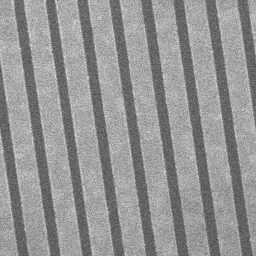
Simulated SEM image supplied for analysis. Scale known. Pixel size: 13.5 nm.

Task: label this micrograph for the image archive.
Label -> parallel lines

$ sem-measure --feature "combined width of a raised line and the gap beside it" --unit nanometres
426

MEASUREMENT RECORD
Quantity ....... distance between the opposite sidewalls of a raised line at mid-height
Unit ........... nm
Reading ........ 280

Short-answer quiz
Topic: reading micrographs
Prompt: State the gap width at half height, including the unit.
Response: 146 nm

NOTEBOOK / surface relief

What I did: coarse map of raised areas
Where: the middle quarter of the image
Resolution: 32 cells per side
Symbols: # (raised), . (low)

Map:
######..######..######..######..
######...#####...#####...#####..
.#####...#####...#####...#####..
.#####...#####...#####...#####..
.#####...#####...#####...#####..
.#####...#####...#####...#####..
.#####...#####...#####...#####..
.######..######..######..######.
..#####...#####...#####...#####.
..#####...#####...#####...#####.
..#####...#####...#####...#####.
..#####...#####...#####...#####.
..#####...#####...#####...#####.
..#####...#####...#####...#####.
..######..######..######..######
..######...#####...#####...#####
...#####...#####...#####...#####
...#####...#####...#####...#####
...#####...#####...#####...#####
...#####...#####...#####...#####
...#####...#####...#####...#####
#..######..######..######..#####
#..######...#####...#####...####
#...#####...#####...#####...####
#...#####...#####...#####...####
#...#####...#####...#####...####
#...#####...#####...#####...####
#...#####...#####...#####...####
##..######..######..######..####
##...#####...#####...#####...###
##...#####...#####...#####...###
##...#####...#####...#####...###